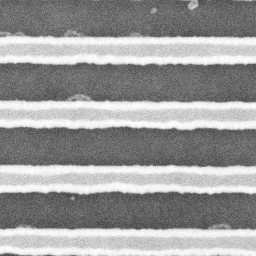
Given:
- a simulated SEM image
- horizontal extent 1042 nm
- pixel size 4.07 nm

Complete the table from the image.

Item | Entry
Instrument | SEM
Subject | lines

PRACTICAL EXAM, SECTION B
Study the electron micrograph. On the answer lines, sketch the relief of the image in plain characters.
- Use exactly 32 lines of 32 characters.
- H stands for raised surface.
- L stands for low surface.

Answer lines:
LLLLLLLLLLLLLLLLLLLLLLLLLLLLLLLL
LLLLLLLLLLLLLLLLLLLLLLLLLLLLLLLL
LLLLLLLLLLLLLLLLLLLLLLLLLLLLLLLL
LLLLLLLLLLLLLLLLLLLLLLLLLLLLLLLL
LLLLLLLLLLLLLLLLLLLLLLLLLLLLLLLL
HHHHHHHHHHHHHHHHHHHHHHHHHHHHHHHH
HHHHHHHHHHHHHHHHHHHHHHHHHHHHHHHH
HHHHHHHHHHHHHHHHHHHHHHHHHHHHHHHH
LLLLLLLLLLLLLLLLLLLLLLLLLLLLLLLL
LLLLLLLLLLLLLLLLLLLLLLLLLLLLLLLL
LLLLLLLLLLLLLLLLLLLLLLLLLLLLLLLL
LLLLLLLLLLLLLLLLLLLLLLLLLLLLLLLL
LLLLLLLLLLLLLLLLLLLLLLLLLLLLLLLL
HHHHHHHHHHHHHHHHHHHHHHHHHHHHHHHH
HHHHHHHHHHHHHHHHHHHHHHHHHHHHHHHH
HHHHHHHHHHHHHHHHHHHHHHHHHHHHHHHH
LLLLLLLLLLLLLLLLLLLLLLLLLLLLLLLL
LLLLLLLLLLLLLLLLLLLLLLLLLLLLLLLL
LLLLLLLLLLLLLLLLLLLLLLLLLLLLLLLL
LLLLLLLLLLLLLLLLLLLLLLLLLLLLLLLL
LLLLLLLLLLLLLLLLLLLLLLLLLLLLLLLL
HHHHHHHHHHHHHHHHHHHHHHHHHHHHHHHH
HHHHHHHHHHHHHHHHHHHHHHHHHHHHHHHH
HHHHHHHHHHHHHHHHHHHHHHHHHHHHHHHH
LLLLLLLLLLLLLLLLLLLLLLLLLLLLLLLL
LLLLLLLLLLLLLLLLLLLLLLLLLLLLLLLL
LLLLLLLLLLLLLLLLLLLLLLLLLLLLLLLL
LLLLLLLLLLLLLLLLLLLLLLLLLLLLLLLL
LLLLLLLLLLLLLLLLLLLLLLLLLLLLLLLL
HHHHHHHHHHHHHHHHHHHHHHHHHHHHHHHH
HHHHHHHHHHHHHHHHHHHHHHHHHHHHHHHH
HHHHHHHHHHHHHHHHHHHHHHHHHHHHHHHH